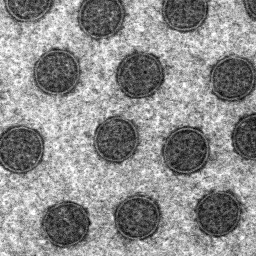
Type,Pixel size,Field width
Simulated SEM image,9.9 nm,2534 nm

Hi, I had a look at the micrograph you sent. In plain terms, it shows a regular array of raised bodies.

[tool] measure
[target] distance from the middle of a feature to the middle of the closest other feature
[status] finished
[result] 704 nm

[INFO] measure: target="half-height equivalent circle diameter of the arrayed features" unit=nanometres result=425